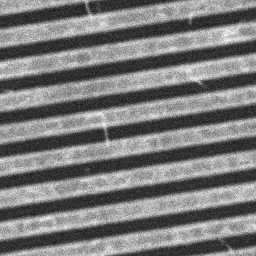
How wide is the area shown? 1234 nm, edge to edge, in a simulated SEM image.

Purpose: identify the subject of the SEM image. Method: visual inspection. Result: parallel lines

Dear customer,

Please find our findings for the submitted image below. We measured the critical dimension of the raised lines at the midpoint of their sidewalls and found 0.0809 µm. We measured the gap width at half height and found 72 nm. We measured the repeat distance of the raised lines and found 153 nanometers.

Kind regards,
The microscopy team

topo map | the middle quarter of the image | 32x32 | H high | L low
HHHHLLLLLLLLLLLLLLLLLLLLLLLLLLHH
LLLLLLLLLLLLLLLLLLLLLLLLHHHHHHHH
LLLLLLLLLLLLLLLLLLHHHHHHHHHHHHHH
LLLLLLLLLLLHHHHHHHHHHHHHHHHHHHHH
LLLLLHHHHHHHHHHHHHHHHHHHHHHHHHLL
HHHHHHHHHHHHHHHHHHHHHHHLLLLLLLLL
HHHHHHHHHHHHHHHHHLLLLLLLLLLLLLLL
HHHHHHHHHHHLLLLLLLLLLLLLLLLLLLLL
HHHHLLLLLLLLLLLLLLLLLLLLLLLLLLHH
LLLLLLLLLLLLLLLLLLLLLLLHHHHHHHHH
LLLLLLLLLLLLLLLLLHHHHHHHHHHHHHHH
LLLLLLLLLLLLHHHHHHHHHHHHHHHHHHHH
LLLLHHHHHHHHHHHHHHHHHHHHHHHHHHLL
HHHHHHHHHHHHHHHHHHHHHHHHLLLLLLLL
HHHHHHHHHHHHHHHHHLLLLLLLLLLLLLLL
HHHHHHHHHHHLLLLLLLLLLLLLLLLLLLLL
HHHHHLLLLLLLLLLLLLLLLLLLLLLLLHHH
LLLLLLLLLLLLLLLLLLLLLLLHHHHHHHHH
LLLLLLLLLLLLLLLLLHHHHHHHHHHHHHHH
LLLLLLLLLLHHHHHHHHHHHHHHHHHHHHHH
LLLLLHHHHHHHHHHHHHHHHHHHHHHHHLLL
HHHHHHHHHHHHHHHHHHHHHHHHLLLLLLLL
HHHHHHHHHHHHHHHHLLLLLLLLLLLLLLLL
HHHHHHHHHHHLLLLLLLLLLLLLLLLLLLLL
HHHLHLLLLLLLLLLLLLLLLLLLLLLLLLHH
LLLLLLLLLLLLLLLLLLLLLLLHHHHHHHHH
LLLLLLLLLLLLLLLLLHHHHHHHHHHHHHHH
LLLLLLLLLLLLHHHHHHHHHHHHHHHHHHHH
LLLLHHHHHHHHHHHHHHHHHHHHHHHHHHLL
HHHHHHHHHHHHHHHHHHHHHHHHLLLLLLLL
HHHHHHHHHHHHHHHHHLLLLLLLLLLLLLLL
HHHHHHHHHHHLLLLLLLLLLLLLLLLLLLLL